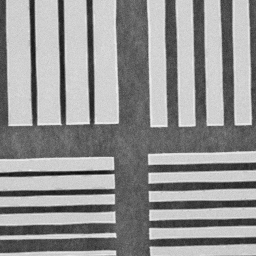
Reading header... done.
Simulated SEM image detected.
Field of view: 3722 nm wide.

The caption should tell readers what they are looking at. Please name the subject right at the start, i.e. groups of lines, slits or small figures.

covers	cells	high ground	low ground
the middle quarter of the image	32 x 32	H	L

HHHHHHLLHHHHHLLLLLLLLHHHHLLLLHHH
HHHHHHLLHHHHHLLLLLLLLHHHHLLLLHHH
HHHHHHLLHHHHHLLLLLLLLHHHHLLLLHHH
HHHHHHLLHHHHHLLLLLLLLHHHHLLLLHHH
HHHHHHLLHHHHHLLLLLLLLLHHHLLLLHHH
HHHHHHLLHHHHHLLLLLLLLLHHHLLLLHHH
LHHHHHLLHHHHHLLLLLLLLLHHHLLLLHHH
LHHHHHLLHHHHHLLLLLLLLLHHHLLLLHHH
LHHHHHLLHHHHHLLLLLLLLLHHHLLLLHHH
LHHHHHLLHHHHHLLLLLLLLLHHHHLLLHHH
LHHHHHLLHHHHHLLLLLLLLLHHHHLLLHHH
LHHHHHLLHHHHHLLLLLLLLLHHHHLLLHHH
LHHHHHLLHHHHHLLLLLLLLLHHHHLLLHHH
LHHHHHLLHHHHHLLLLLLLLLHHHHLLLHHH
LHHHHHLLHHHHHLLLLLLLLLHHHHLLLHHH
LLLLLLLLLLLLLLLLLLLLLLHLLLLLLLLL
LLLLLLLLLLLLLLLLLLLLLLLLLLLLLLLL
LLLLLLLLLLLLLLLLLLLLLLLLLLLLLLLL
LLLLLLLLLLLLLLLLLLLLLLLLLLLLLLLL
LLLLLLLLLLLLLLLLLLLLLLLLLLLLLLLL
LLLLLLLLLLLLLLLLLLLLLLLLLLLLLLLL
LLLLLLLLLLLLLLLLLLLLLLLLLLLLLLLL
LLLLLLLLLLLLLLLLLLLLLLLLLLLLLLLL
LLLLLLLLHHHHLLLLLLLLLHHHHHHHHHHH
HHHHHHHHHHHHLLLLLLLLLHHHHHHHHHHH
HHHHHHHHHHHHLLLLLLLLLLLLLLLLLLLL
HHHHHHHHLLLLLLLLLLLLLLLLLLLLLLLL
LLLLLLLLLLLLLLLLLLLLLLHHHHHHHHHH
HHHHHHHHHHHHLLLLLLLLLHHHHHHHHHHH
HHHHHHHHHHHHHLLLLLLLLHHHHHHLLLLL
HHHHHHHHHHHHHLLLLLLLLLLLLLLLLLLL
LLLLLLLLLLLLLLLLLLLLLLLLLLLLLLLL